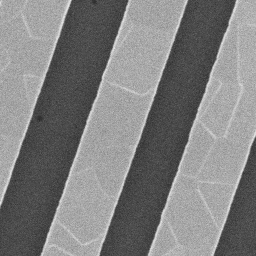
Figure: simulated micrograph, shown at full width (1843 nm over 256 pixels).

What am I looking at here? lines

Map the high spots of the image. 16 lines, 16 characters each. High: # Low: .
####....####...#
####....###...##
####...####...##
###....####...##
###....###...###
###...####...###
##....###....###
##...####...####
##...####...####
#....###....####
#...####...####.
....####...####.
....###...#####.
...####...####..
...####...####..
...###...####...